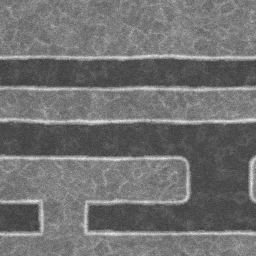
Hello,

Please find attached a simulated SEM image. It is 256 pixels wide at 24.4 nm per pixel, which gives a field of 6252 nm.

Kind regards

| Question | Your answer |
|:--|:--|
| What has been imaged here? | one or a few lines or trenches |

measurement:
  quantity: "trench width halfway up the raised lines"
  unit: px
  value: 32.9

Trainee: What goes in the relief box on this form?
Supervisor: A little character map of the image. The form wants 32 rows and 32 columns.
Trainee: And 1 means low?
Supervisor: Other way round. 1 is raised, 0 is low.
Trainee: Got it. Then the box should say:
11111111111111111111111111111111
11111111111111111111111111111111
11111111111111111111111111111111
11111111111111111111111111111111
11111111111111111111111111111111
11111111111111111111111111111111
11111111111111111111111111111111
00000000000000000000000000000000
00000000000000000000000000000000
00000000000000000000000000000000
00000000000000000000000000000000
11111111111111111111111111111111
11111111111111111111111111111111
11111111111111111111111111111111
11111111111111111111111111111111
00000000000000000000000000000000
00000000000000000000000000000000
00000000000000000000000000000000
00000000000000000000000000000000
00000000000000000000000000000000
11111111111111111111111000000000
11111111111111111111111000000000
11111111111111111111111000000000
11111111111111111111111000000000
11111111111111111111111000000000
00000111111000000000000000000000
00000111111000000000000000000000
00000111111000000000000000000000
00000111111000000000000000000000
11111111111111111111111111111111
11111111111111111111111111111111
11111111111111111111111111111111